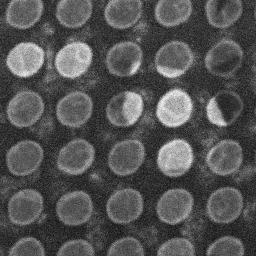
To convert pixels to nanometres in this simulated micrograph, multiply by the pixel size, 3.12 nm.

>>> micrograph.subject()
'a regular array of raised bodies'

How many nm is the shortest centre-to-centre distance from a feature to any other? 151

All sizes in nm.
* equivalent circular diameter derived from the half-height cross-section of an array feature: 107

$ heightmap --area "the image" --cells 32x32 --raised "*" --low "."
.****..****...****..****..****..
.****..****..*****.*****..****..
.***....***..****...***...***...
................................
................................
...*.....*.....**....**....**...
.****...***...****..****..****..
.****..****...***...****..****..
.****..****...***...***...****..
........*.......................
................................
.....................*......*...
..***...***...****..****..****..
.****..****..*****..****..****..
.****..****...***...****..****..
..**....**....**.....**.........
................................
................................
..***...***...****...***...***..
.****..*****..****..****..****..
.****..****...****..****..****..
..**....**....***....**....**...
................................
................................
..***...***...***...****...***..
.****..****...****..****..****..
.****..****...****..****..****..
..**....***...***...***....**...
................................
................................
..***...***...***....***...***..
.****..*****..****..****..****..